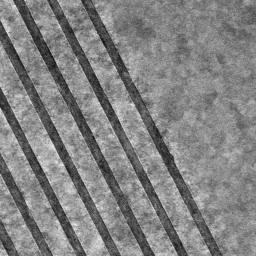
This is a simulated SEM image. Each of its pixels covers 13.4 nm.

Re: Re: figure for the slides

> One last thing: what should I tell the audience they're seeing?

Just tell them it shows parallel lines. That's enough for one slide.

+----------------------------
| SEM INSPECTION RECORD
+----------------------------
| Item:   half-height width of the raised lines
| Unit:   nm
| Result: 263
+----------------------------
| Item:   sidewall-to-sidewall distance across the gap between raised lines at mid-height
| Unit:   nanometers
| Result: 138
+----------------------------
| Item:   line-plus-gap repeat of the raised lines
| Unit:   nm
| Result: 403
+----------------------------